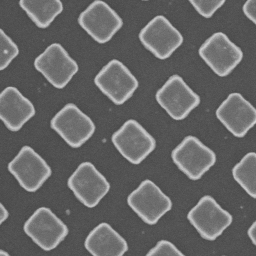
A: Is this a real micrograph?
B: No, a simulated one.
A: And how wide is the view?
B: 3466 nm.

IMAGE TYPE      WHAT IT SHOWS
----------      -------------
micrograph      a regular array of raised bodies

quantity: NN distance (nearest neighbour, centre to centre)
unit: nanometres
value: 837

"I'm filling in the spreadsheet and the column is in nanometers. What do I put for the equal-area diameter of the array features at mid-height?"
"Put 520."